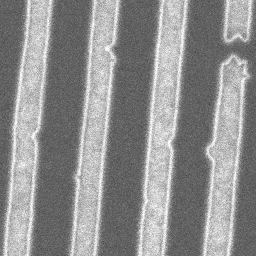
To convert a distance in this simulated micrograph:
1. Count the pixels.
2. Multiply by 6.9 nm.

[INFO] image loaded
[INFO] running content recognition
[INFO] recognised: one or a few lines or trenches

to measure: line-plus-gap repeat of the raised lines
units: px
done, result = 66.7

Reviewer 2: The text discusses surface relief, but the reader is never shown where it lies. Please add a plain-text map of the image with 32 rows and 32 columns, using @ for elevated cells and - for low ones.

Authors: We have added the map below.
@@@@--@@@@@@---@@@@@---@@@@@@--@
@@@@--@@@@@@--@@@@@@---@@@@@---@
@@@@--@@@@@@--@@@@@@---@@@@@---@
@@@---@@@@@@--@@@@@@---@@@@@---@
@@@---@@@@@@--@@@@@@---@@@@@---@
@@@---@@@@@---@@@@@@---@@@@@@@@@
@@@---@@@@@---@@@@@@---@@@@@@@@@
@@@---@@@@@---@@@@@@---@@@@@@-@@
@@@--@@@@@@---@@@@@@--@@@@@@---@
@@@--@@@@@@---@@@@@---@@@@@@---@
@@@--@@@@@@---@@@@@---@@@@@@--@@
@@---@@@@@@---@@@@@---@@@@@@--@@
@@---@@@@@@---@@@@@---@@@@@---@@
@@---@@@@@@--@@@@@@---@@@@@---@@
@@---@@@@@@--@@@@@@---@@@@@---@@
@@---@@@@@@--@@@@@@---@@@@@---@@
@@--@@@@@@---@@@@@@---@@@@@---@@
@@--@@@@@@---@@@@@@--@@@@@@---@@
@@--@@@@@@---@@@@@@--@@@@@----@@
@@--@@@@@@---@@@@@@--@@@@@----@@
@@--@@@@@@---@@@@@---@@@@@@--@@@
@@--@@@@@@---@@@@@---@@@@@@--@@@
@@--@@@@@@---@@@@@---@@@@@@--@@@
@---@@@@@@--@@@@@@---@@@@@@--@@@
@---@@@@@@--@@@@@@---@@@@@---@@@
@---@@@@@@--@@@@@@---@@@@@---@@@
@---@@@@@@--@@@@@@---@@@@@---@@@
@---@@@@@---@@@@@@---@@@@@---@@@
@---@@@@@---@@@@@@---@@@@@---@@@
@---@@@@@---@@@@@@---@@@@@---@@@
@---@@@@@---@@@@@@--@@@@@@---@@@
@--@@@@@@---@@@@@@--@@@@@@---@@@